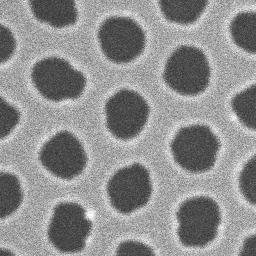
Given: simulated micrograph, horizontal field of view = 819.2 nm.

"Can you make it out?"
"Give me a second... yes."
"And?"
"a regular array of holes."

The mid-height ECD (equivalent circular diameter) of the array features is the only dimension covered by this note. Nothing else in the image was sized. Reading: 157 nanometers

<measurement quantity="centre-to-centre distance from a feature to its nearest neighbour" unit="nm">234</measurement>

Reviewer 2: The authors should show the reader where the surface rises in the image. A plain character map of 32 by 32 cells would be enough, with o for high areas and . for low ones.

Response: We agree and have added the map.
oooo.....ooooooooooo......oooooo
oooo......oooooooooo.....ooooo..
ooooo.....ooo....oooo....oooo...
.oooooo.oooo......ooooooooooo...
..oooooooooo......ooooooooooo...
..oooooooooo......ooooooooooo...
..ooooooooooo.....oooo....ooooo.
.oooo...oooooo...oooo.....oooooo
oooo.....ooooooooooo......oooooo
oooo.......ooooooooo......oooooo
oooo.......oooooooooo.....oooooo
ooooo.....ooooo..ooooo...ooooo..
.ooooo..ooooo.....ooooooooooo...
..ooooooooooo......oooooooooo...
...oooooooooo......oooooooooo...
..ooooooooooo.....oooooo.ooooo..
.oooooo..ooooo....oooo.....ooooo
oooooo....ooooo.oooooo.....ooooo
ooooo.....ooooooooooo.......oooo
ooooo......ooooooooooo.....ooooo
ooooo......ooooo..oooo.....ooo..
.ooooo....oooo.....oooo...oooo..
..oooooo.ooooo.....ooooooooooo..
...oooooooooo......ooooooooooo..
...oooooooooo......oooooo.oooo..
...oooo...oooo....ooooo....oooo.
..ooooo....oooo..ooooo......oooo
oooooo.....ooooooooooo......oooo
oooooo.....ooooooooooo.....ooooo
oooooo.....ooooooooooo.....oooo.
oooooo.....oooo...ooooo...oooo..
..ooooo...oooo.....ooooooooooo..